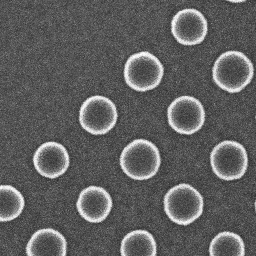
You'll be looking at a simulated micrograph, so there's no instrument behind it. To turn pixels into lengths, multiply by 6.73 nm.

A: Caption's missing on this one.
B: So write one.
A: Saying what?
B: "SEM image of a regular array of raised bodies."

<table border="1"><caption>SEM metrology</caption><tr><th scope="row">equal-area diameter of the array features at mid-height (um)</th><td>0.241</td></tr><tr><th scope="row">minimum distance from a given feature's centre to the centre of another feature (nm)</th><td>416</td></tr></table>